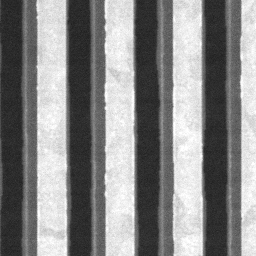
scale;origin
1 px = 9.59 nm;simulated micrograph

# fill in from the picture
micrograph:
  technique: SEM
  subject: lines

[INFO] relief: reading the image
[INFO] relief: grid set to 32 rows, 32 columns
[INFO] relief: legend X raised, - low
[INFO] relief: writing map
---XXXXX----XXXXX---XXXXX----XXX
---XXXXX----XXXXX---XXXXX----XXX
---XXXXX----XXXXX---XXXXX----XXX
---XXXXX----XXXXX---XXXXX----XXX
---XXXXX----XXXXX---XXXXX----XXX
---XXXXX----XXXXX---XXXXX----XXX
---XXXXX----XXXXX---XXXXX----XXX
---XXXXX----XXXXX---XXXXX----XXX
---XXXXX----XXXXX---XXXXX----XXX
---XXXXX----XXXXX---XXXXX----XXX
---XXXXX----XXXXX---XXXXX----XXX
---XXXXX----XXXXX---XXXXX----XXX
---XXXXX----XXXXX---XXXXX----XXX
---XXXXX----XXXXX---XXXXX----XXX
---XXXXX----XXXXX---XXXXX----XXX
---XXXXX----XXXXX---XXXXX----XXX
---XXXXX----XXXXX---XXXXX----XXX
---XXXXX----XXXXX---XXXXX----XXX
---XXXXX----XXXXX---XXXXX----XXX
---XXXXX----XXXXX---XXXXX----XXX
---XXXXX----XXXXX---XXXXX----XXX
---XXXXX----XXXXX---XXXXX----XXX
---XXXXX----XXXXX---XXXXX----XXX
---XXXXX----XXXXX---XXXXX----XXX
---XXXXX----XXXXX---XXXXX----XXX
---XXXXX----XXXXX---XXXXX----XXX
---XXXXX----XXXXX---XXXXX----XXX
---XXXXX----XXXXX---XXXXX----XXX
---XXXXX----XXXXX---XXXXX----XXX
---XXXXX----XXXXX---XXXXX----XXX
---XXXXX----XXXXX---XXXXX----XXX
---XXXXX----XXXXX---XXXXX----XXX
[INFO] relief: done